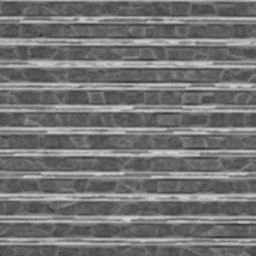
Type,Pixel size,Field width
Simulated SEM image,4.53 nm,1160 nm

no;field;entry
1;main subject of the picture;parallel lines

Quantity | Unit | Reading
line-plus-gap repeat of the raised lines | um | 0.1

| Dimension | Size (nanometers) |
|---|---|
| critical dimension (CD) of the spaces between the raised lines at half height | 70.7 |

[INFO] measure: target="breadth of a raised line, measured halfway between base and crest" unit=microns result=0.0294